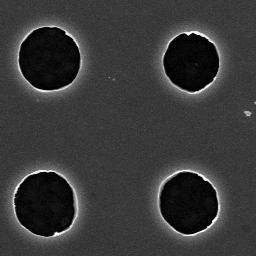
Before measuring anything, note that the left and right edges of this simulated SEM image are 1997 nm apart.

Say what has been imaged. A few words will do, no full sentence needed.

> holes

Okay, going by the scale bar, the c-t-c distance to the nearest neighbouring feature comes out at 1100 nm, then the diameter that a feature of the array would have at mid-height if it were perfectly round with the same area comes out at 480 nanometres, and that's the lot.